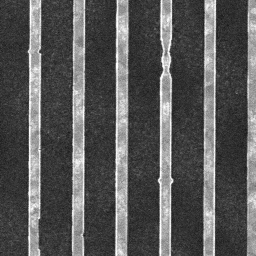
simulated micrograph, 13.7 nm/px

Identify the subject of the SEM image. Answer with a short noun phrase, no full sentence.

parallel lines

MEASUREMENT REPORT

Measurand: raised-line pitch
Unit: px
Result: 43.7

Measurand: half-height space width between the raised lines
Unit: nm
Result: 463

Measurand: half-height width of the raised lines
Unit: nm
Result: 139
